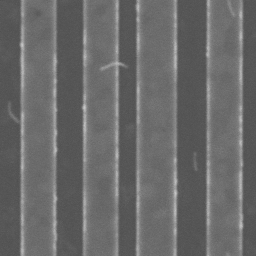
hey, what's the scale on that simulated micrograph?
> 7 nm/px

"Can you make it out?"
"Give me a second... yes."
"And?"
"one or a few lines or trenches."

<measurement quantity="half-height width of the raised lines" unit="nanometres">242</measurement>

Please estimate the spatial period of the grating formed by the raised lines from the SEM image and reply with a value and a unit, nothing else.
434 nanometres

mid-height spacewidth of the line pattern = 0.193 micrometres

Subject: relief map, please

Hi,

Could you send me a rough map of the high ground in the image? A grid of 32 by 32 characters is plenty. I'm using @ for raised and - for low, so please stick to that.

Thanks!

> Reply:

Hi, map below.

---@@@@----@@@@--@@@@@----@@@@--
---@@@@----@@@@--@@@@@----@@@@--
---@@@@----@@@@--@@@@@----@@@@--
---@@@@----@@@@--@@@@@----@@@@--
---@@@@----@@@@--@@@@@----@@@@--
---@@@@----@@@@--@@@@@----@@@@--
---@@@@----@@@@--@@@@@----@@@@--
---@@@@----@@@@--@@@@@----@@@@--
---@@@@----@@@@--@@@@@----@@@@--
---@@@@----@@@@--@@@@@----@@@@--
---@@@@----@@@@--@@@@@----@@@@--
---@@@@----@@@@--@@@@@----@@@@--
---@@@@----@@@@--@@@@@----@@@@--
---@@@@---@@@@@--@@@@@----@@@@--
---@@@@----@@@@--@@@@@----@@@@--
---@@@@----@@@@--@@@@@----@@@@--
---@@@@---@@@@@--@@@@@----@@@@--
---@@@@---@@@@@--@@@@@----@@@@--
---@@@@---@@@@@--@@@@@----@@@@--
---@@@@---@@@@@--@@@@@----@@@@--
---@@@@---@@@@@--@@@@@----@@@@--
---@@@@---@@@@@--@@@@@----@@@@--
---@@@@---@@@@@--@@@@@----@@@@--
---@@@@---@@@@@--@@@@@----@@@@--
---@@@@---@@@@@--@@@@@----@@@@--
---@@@@---@@@@@--@@@@@----@@@@--
---@@@@---@@@@@--@@@@@----@@@@--
---@@@@---@@@@@--@@@@@----@@@@--
---@@@@---@@@@@--@@@@@----@@@@--
---@@@@---@@@@@--@@@@@----@@@@--
---@@@@---@@@@@--@@@@@----@@@@--
---@@@@---@@@@@--@@@@@----@@@@--